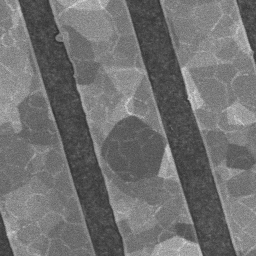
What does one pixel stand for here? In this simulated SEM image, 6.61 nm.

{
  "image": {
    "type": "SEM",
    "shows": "one or a few lines or trenches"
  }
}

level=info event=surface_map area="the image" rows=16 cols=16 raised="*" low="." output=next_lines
*..*****..*****.
**..****..*****.
**..*****..****.
**..*****..*****
**...****..*****
***..****...****
***..*****..****
***..*****..****
****..****...***
****..*****..***
****..*****..***
*****..****...**
*****..*****..**
*****..*****..**
*****...****..**
.*****..****...*